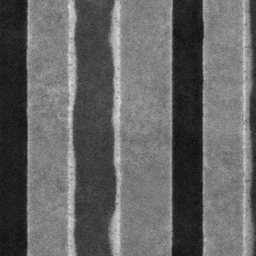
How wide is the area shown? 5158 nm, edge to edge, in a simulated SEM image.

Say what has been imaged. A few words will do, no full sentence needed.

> lines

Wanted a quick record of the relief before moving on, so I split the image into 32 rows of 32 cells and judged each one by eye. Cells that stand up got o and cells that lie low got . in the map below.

....ooooo......ooooooo...oooooo.
....ooooo......ooooooo...oooooo.
....ooooo......oooooo....oooooo.
....ooooo......oooooo.....ooooo.
....ooooo......oooooo.....ooooo.
....ooooo......oooooo....oooooo.
...oooooo......oooooo....oooooo.
...oooooo......oooooo....oooooo.
...oooooo......oooooo....oooooo.
....ooooo......oooooo....oooooo.
....ooooo......oooooo....oooooo.
....ooooo......oooooo....oooooo.
....ooooo......oooooo....oooooo.
...oooooo......oooooo....oooooo.
...oooooo......oooooo....oooooo.
....ooooo......oooooo....oooooo.
....ooooo......oooooo....oooooo.
....ooooo......oooooo....oooooo.
....ooooo......oooooo....oooooo.
....ooooo......oooooo....oooooo.
....ooooo......oooooo....oooooo.
....ooooo......oooooo....oooooo.
....ooooo......oooooo....oooooo.
...oooooo......oooooo....oooooo.
....ooooo......oooooo....oooooo.
...oooooo......oooooo....oooooo.
...oooooo......oooooo....oooooo.
....ooooo......oooooo....oooooo.
....ooooo......oooooo....oooooo.
....ooooo......oooooo....oooooo.
....ooooo......oooooo.....ooooo.
....ooooo......oooooo....oooooo.